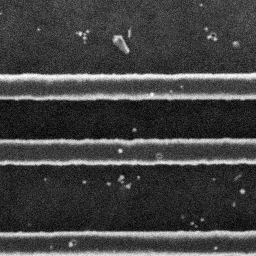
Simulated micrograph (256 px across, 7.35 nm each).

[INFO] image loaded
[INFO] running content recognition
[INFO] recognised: lines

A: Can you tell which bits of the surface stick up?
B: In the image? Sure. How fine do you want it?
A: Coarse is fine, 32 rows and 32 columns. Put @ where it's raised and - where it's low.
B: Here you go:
--------------------------------
--------------------------------
--------------------------------
--------------------------------
--------------------------------
--------------------------------
--------------------------------
--------------------------------
--------------------------------
--@@@---@@@@@@@@@@@@@@@@@@@@@@@@
@@@@@@@@@@@@@@@@@@@@@@@@@@@@@@@@
@@@@@@@@@@@@@@@@@@@@@@@@@@@@@@@@
--------------------------------
--------------------------------
--------------------------------
--------------------------------
--------------------------------
-------------------@--@----@@@@@
@@@@@@@@@@@@@@@@@@@@@@@@@@@@@@@@
@@@@@@@@@@@@@@@@@@@@@@@@@@@@@@@@
--@@@-@@@--@--@---@@--@---------
--------------------------------
--------------------------------
--------------------------------
--------------------------------
--------------------------------
--------------------------------
--------------------------------
--------------------------------
@@@@@@@@@@@@@@@@@@@@@@@@@@@@@@@@
@@@@@@@@@@@@@@@@@@@@@@@@@@@@@@@@
@@@@@@@@@@@@@@@@@@@@@@@@@@@@@@@@